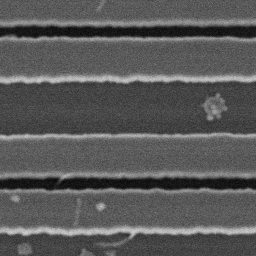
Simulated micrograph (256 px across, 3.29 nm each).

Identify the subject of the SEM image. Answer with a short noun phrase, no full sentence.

lines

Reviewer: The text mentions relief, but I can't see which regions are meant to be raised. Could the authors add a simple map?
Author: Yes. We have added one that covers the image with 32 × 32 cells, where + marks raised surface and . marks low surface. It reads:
++++++++++++++++++++++++++++++++
++++++++++++++++++++++++++++++++
++++++++++++++++++++++++++++++++
................................
................................
++++++++++++++++++++++++++++++++
++++++++++++++++++++++++++++++++
++++++++++++++++++++++++++++++++
++++++++++++++++++++++++++++++++
++++++++++++++++++++++++++++++++
................................
................................
................................
................................
................................
................................
................................
++++++++++++++++++++++++++++++++
++++++++++++++++++++++++++++++++
++++++++++++++++++++++++++++++++
++++++++++++++++++++++++++++++++
++++++++++++++++++++++++++++++++
................................
................................
++++++++++++++++++++++++++++++++
++++++++++++++++++++++++++++++++
++++++++++++++++++++++++++++++++
++++++++++++++++++++++++++++++++
++++++++++++++++++++++++++++++++
................................
................................
................................